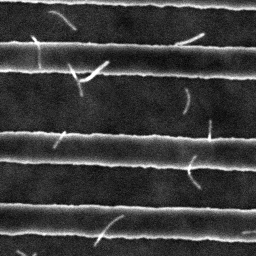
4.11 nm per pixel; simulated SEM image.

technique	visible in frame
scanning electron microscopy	lines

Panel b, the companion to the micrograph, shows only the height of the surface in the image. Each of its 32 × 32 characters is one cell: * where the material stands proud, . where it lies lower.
........**..********************
................................
................................
................................
................................
***************.................
********************************
********************************
********************************
...........*..........**********
................................
................................
................................
................................
................................
................................
................................
********************************
********************************
********************************
.........***********************
................................
................................
................................
................................
***.............................
********************************
********************************
********************************
..........**********************
................................
................................